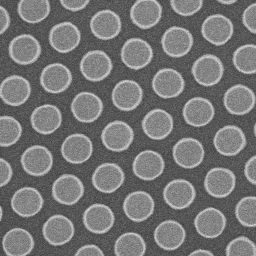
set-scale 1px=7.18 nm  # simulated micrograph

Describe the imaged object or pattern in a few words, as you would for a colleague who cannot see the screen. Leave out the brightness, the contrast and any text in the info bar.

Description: a regular array of raised bodies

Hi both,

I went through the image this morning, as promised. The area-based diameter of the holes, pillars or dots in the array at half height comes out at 0.213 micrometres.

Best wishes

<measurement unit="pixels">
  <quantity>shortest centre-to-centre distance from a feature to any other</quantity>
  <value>41.8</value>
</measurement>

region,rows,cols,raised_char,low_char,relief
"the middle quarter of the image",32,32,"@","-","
----@@@@@@@@----@@@@------------
@---@@@@@@@@-------------@@-----
@@---@@@@@@------------@@@@@@---
@@----@@@@-------------@@@@@@---
@-------------@@@@----@@@@@@@@--
@------------@@@@@@---@@@@@@@@--
------------@@@@@@@----@@@@@@---
----@@@-----@@@@@@@----@@@@@@---
---@@@@@@---@@@@@@@-------------
--@@@@@@@---@@@@@@@------------@
--@@@@@@@----@@@@@------------@@
--@@@@@@@--------------@------@@
--@@@@@@@------------@@@@@----@@
---@@@@@------------@@@@@@@---@@
--------------------@@@@@@@----@
-----------@@@@@----@@@@@@@-----
----------@@@@@@@---@@@@@@@-----
----------@@@@@@@----@@@@@------
-@@@@@----@@@@@@@-----@@@-------
@@@@@@@---@@@@@@@------------@@@
@@@@@@@---@@@@@@------------@@@@
@@@@@@@-----@@@------------@@@@@
@@@@@@@------------@@@@----@@@@@
@@@@@@------------@@@@@@---@@@@@
--@@--------------@@@@@@@---@@@@
---------@@@@----@@@@@@@@----@@@
--------@@@@@@----@@@@@@@-------
--------@@@@@@@---@@@@@@--------
@@@----@@@@@@@@----@@@@---------
@@@@---@@@@@@@@------------@@@@-
@@@@----@@@@@@------------@@@@@@
@@@@@----@@@@------------@@@@@@@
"